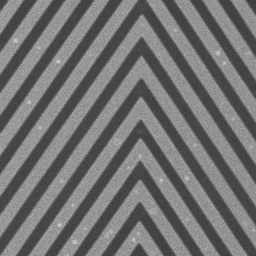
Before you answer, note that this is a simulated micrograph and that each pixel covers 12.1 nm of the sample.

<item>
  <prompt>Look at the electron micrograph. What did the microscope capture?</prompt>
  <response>groups of lines, slits or small figures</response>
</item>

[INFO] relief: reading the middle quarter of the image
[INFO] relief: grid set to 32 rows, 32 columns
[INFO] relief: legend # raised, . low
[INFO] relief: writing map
...####...####....###....###....
..####....###....#####...####...
..###....####...######....####..
.####...####...########....###..
####...####....###..####...####.
###....###....####...###....###.
###...####...####.....###....###
##...####....###......####...###
#....###....###........####...##
#...####...####...##....###....#
...####...####....###...####...#
...###....###....#####...####...
..###....####...######...####...
.####...####....#######...####..
####....###....###..####...####.
####...####...####...###...####.
###...####...####....####...####
##....###....###......####...###
#....###....####......####....##
#...####...####...##...####...##
...####...####....###...####...#
...###....###....####...####...#
..####...####...######...####...
.####...####....#######...####..
.###....###....########....###..
####...####...####..####...####.
###...####...####....####...###.
##....###....###......###...####
#....####...####......####...###
#...####...####........####...##
....###....###....##....###....#
...###....####...####...####...#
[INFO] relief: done